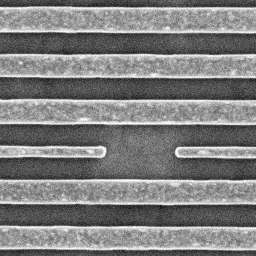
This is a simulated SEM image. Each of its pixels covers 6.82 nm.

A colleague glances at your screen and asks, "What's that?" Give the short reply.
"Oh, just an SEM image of wiring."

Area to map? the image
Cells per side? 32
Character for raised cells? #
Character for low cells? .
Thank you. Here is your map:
................................
################################
################################
################################
................................
................................
................................
################################
################################
################################
................................
................................
#########.......................
################################
################################
................................
................................
................................
#############.........##########
###..########.........##########
................................
................................
................................
################################
################################
....................##..........
................................
................................
##############################..
################################
################################
................................